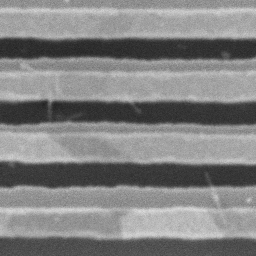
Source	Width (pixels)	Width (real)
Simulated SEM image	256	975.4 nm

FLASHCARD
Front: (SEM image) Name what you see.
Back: lines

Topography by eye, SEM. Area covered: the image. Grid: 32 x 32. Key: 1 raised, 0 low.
11111111111111111111111111111111
11111111111111111111111111111111
11111111111111111111111111111111
11111111111111111111111111111111
11111111111111111111111111111111
00000000000000000000000000000000
00000000000000000000000000000000
11101111111111110000000000000001
11111111111111111111111111111111
11111111111111111111111111111111
11111111111111111111111111111111
11111111111111111111111111111111
01100010000001111111000111111111
00000000000000000000000000000000
00000000000000000000000000000000
00000111111111110000000000000000
11111111111111111111111111111111
11111111111111111111111111111111
11111111111111111111111111111111
11111111111111111111111111111111
00000000000000000000000000000011
00000000000000000000000000000000
00000000000000000000000000000000
00111100111111111111000000111111
11111111111111111111111111111111
11111111111111111111111111111111
11111111111111111111111111111111
11111111111111111111111111111111
11111111111111111111111111111111
01011100101111111111111111111111
00000000000000000000000000000000
00000000000000000000000000000000